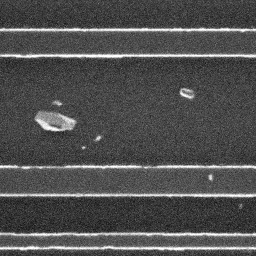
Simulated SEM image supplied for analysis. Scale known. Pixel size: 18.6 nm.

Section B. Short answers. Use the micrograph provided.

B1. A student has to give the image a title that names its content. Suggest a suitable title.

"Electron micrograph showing lines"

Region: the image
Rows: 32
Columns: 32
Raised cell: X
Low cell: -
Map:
--------------------------------
--------------------------------
--------------------------------
--------------------------------
XXXXXXXXXXXXXXXXXXXXXXXXXXXXXXXX
XXXXXXXXXXXXXXXXXXXXXXXXXXXXXXXX
XXXXXXXXXXXXXXXXXXXXXXXXXXXXXXXX
--------------------------------
--------------------------------
--------------------------------
--------------------------------
--------------------------------
--------------------------------
--------------------------------
--------------------------------
--------------------------------
--------------------------------
--------------------------------
--------------------------------
--------------------------------
--------------------------------
XXXXXXXXXXXXXXXXXXXXXXXXXXXXXXXX
XXXXXXXXXXXXXXXXXXXXXXXXXXXXXXXX
XXXXXXXXXXXXXXXXXXXXXXXXXXXXXXXX
--------------------------------
--------------------------------
--------------------------------
--------------------------------
--------------------------------
XXXXXXXXXXXXXXXXXXXXXXXXXXXXXXXX
XXXXXXXXXXXXXXXXXXXXXXXXXXXXXXXX
--------------------------------